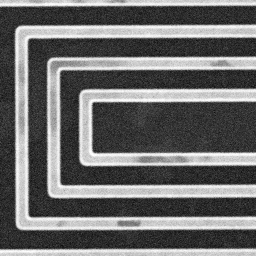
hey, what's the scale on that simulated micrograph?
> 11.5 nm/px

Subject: groups of lines, slits or small figures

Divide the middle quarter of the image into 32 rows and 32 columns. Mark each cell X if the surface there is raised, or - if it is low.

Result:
XXXXXXXXXXXXXXXXXXXXXXXXXXXXXXXX
--------------------------------
--------------------------------
--------------------------------
--------------------------------
--------------------------------
--------------------------------
----XXXXXXXXXXXXXXXXXXXXXXXXXXXX
----XXXXXXXXXXXXXXXXXXXXXXXXXXXX
----XXX-------------------------
----XXX-------------------------
----XXX-------------------------
----XXX-------------------------
----XXX-------------------------
----XXX-------------------------
----XXX-------------------------
----XXX-------------------------
----XXX-------------------------
----XXX-------------------------
----XXX-------------------------
----XXX-------------------------
----XXX-------------------------
----XXXX------------------------
----XXXXXXXXXXXXXXXXXXXXXXXXXXXX
----XXXXXXXXXXXXXXXXXXXXXXXXXXXX
--------------------------------
--------------------------------
--------------------------------
--------------------------------
--------------------------------
--------------------------------
XXXXXXXXXXXXXXXXXXXXXXXXXXXXXXXX